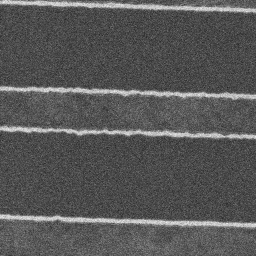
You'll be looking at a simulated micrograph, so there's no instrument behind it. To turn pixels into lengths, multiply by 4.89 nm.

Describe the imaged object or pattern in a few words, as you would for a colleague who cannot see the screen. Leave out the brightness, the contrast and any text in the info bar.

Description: one or a few lines or trenches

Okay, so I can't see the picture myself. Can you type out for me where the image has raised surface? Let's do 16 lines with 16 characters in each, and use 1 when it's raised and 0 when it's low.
1111111111100000
1111111111111111
1111111111111111
1111111111111111
1111111111111111
1111111111111111
0000000000000000
0000000000000000
1111111111111100
1111111111111111
1111111111111111
1111111111111111
1111111111111111
1111111111111111
0000000000000000
0000000000000000